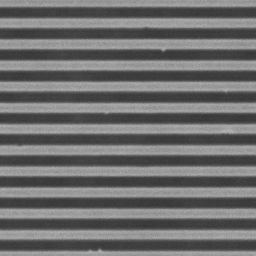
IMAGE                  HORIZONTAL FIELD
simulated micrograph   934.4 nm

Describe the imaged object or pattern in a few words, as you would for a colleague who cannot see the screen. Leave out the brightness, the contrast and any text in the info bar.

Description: parallel lines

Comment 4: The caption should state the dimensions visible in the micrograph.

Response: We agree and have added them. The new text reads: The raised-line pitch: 0.0773 µm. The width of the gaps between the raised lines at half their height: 36.5 nanometres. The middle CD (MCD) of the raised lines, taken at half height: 40.2 nanometers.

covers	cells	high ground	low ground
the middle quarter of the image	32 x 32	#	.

################################
################################
................................
................................
################################
################################
################################
................................
................................
................................
################################
################################
..........#.....................
................................
................................
################################
################################
###########################.####
................................
................................
################################
################################
################################
................................
................................
................................
################################
################################
................................
................................
................................
################################